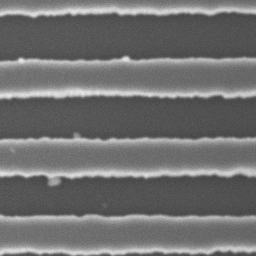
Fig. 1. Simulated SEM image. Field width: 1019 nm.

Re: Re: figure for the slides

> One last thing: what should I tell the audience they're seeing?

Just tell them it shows lines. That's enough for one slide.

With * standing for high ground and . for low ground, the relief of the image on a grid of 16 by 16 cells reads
****************
................
................
................
****************
****************
................
................
................
****************
****************
................
................
.....*..**......
****************
****************